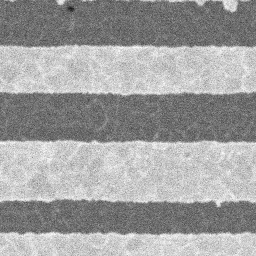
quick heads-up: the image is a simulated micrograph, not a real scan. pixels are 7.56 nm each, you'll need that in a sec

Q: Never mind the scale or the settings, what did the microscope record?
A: one or a few lines or trenches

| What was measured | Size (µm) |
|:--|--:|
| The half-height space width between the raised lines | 0.332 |